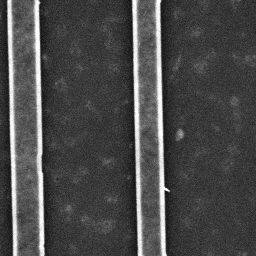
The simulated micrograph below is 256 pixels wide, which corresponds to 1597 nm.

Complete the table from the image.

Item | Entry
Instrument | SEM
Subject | one or a few lines or trenches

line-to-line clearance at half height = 603 nm